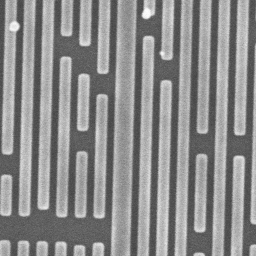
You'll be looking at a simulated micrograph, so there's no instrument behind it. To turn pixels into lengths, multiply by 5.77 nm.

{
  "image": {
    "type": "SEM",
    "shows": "groups of lines, slits or small figures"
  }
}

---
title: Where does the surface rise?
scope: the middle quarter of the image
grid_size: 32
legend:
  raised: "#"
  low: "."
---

##......###..#####..##.......##.
##......###..#####..##.......##.
#............#####..##.......##.
#...##.......#####..##.......##.
#...##.......####...##..###..##.
#...##.......####...##..###..##.
#...##.......####...##..###..##.
#...##.......####..###..###..##.
#...##..###..####..###..###..##.
#...##..###..####..###..###..##.
#...##..###..####..###..###..##.
#...##..###..####..###..###..##.
#...##..###..####..###..###..##.
#...##..###..####..###..###..##.
#...##..###..####..###..###..##.
#...##..###..####..###..###..##.
#...##..###..####..###..###..##.
#.......##...####..###..###..##.
#.......##...####..###..##...##.
#.......##...####..###..##...##.
#.......##...####..###..##...##.
#.......##..#####..###..##...##.
#..###..##..#####..###..##...##.
#..###..##..#####..###..##..###.
#..###..##..#####..###..##..###.
#..###..##..#####..###..##..###.
#..###..##..#####..###..##..###.
#..###..##..#####..###..##..###.
#..###..##..#####..##...##..###.
#..###..##..#####..##...##..###.
#..###..##..#####..##...##..###.
#..###..##..#####..##...##..###.